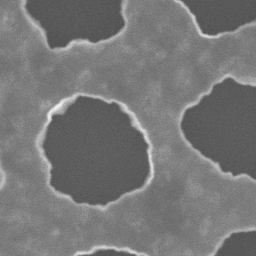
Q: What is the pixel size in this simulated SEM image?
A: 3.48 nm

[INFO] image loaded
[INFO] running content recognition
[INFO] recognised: holes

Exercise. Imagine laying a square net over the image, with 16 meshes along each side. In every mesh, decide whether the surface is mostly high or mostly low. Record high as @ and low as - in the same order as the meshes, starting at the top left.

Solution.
@@------@@@@----
@@------@@@@---@
@@@---@@@@@@@@@@
@@@@@@@@@@@@@@@@
@@@@@@@@@@@@@@@@
@@@@@@@@@@@@@---
@@@@---@@@@@----
@@@-----@@@-----
@@@------@@@----
@@@------@@@----
@@@------@@@@@--
@@@------@@@@@@@
@@@@@--@@@@@@@@@
@@@@@@@@@@@@@@@@
@@@@@@@@@@@@@@@-
@@@@@@@@@@@@@@--